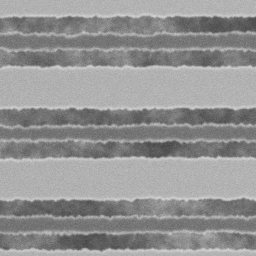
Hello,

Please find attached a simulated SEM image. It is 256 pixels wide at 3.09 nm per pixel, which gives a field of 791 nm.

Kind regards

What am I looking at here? lines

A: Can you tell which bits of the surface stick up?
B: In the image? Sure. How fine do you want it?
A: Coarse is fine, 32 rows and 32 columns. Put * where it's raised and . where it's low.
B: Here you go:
********************************
********************************
................................
................................
********************************
********************************
................................
................................
********************************
********************************
********************************
********************************
********************************
**********************.****.****
................................
...................*......*.*...
********************************
********************************
................................
................................
********************************
********************************
********************************
********************************
********************************
................................
................................
********************************
********************************
................................
................................
********************************